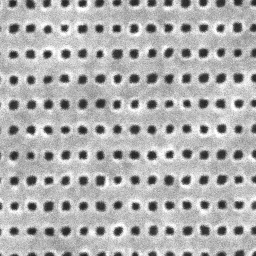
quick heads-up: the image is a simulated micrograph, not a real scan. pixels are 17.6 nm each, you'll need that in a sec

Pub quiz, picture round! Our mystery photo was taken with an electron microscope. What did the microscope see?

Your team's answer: a regular array of holes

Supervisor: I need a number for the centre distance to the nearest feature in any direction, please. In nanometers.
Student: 299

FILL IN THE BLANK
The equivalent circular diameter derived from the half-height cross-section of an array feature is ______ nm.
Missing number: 188